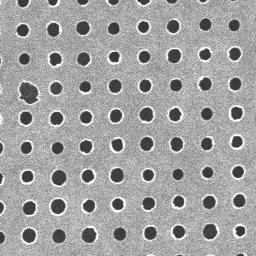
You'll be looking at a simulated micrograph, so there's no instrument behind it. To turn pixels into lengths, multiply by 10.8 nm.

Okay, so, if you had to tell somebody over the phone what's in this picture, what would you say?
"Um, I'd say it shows a regular array of holes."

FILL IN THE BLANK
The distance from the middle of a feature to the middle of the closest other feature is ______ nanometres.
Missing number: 311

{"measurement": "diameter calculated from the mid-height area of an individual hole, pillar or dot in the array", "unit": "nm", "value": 136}